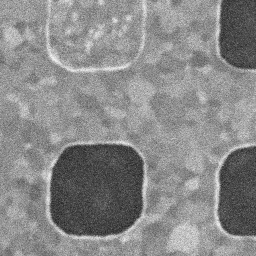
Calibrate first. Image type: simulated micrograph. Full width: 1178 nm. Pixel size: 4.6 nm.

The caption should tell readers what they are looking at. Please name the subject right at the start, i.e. holes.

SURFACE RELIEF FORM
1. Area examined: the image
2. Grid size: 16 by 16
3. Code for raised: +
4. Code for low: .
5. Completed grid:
+++......+++++..
+++......+++++..
+++......+++++..
+++......+++++..
++++++++++++++++
++++++++++++++++
++++++++++++++++
++++++++++++++++
++++++++++++++++
++++.....+++++..
+++......+++++..
+++......+++++..
+++......+++++..
+++......+++++..
++++....++++++..
++++++++++++++++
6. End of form